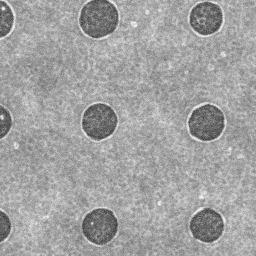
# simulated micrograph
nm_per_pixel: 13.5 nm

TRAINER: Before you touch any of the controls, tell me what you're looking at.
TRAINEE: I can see holes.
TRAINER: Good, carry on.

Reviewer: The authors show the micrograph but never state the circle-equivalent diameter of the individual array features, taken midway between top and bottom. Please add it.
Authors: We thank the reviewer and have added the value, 505 nm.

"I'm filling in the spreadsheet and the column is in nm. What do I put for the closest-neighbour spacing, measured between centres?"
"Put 1400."